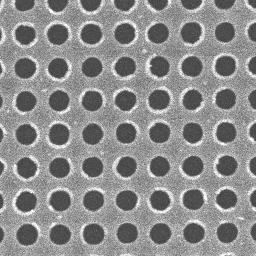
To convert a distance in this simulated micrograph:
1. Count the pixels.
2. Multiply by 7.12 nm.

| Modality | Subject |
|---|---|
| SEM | a regular array of holes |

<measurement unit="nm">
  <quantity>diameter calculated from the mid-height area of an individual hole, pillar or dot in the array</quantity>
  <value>147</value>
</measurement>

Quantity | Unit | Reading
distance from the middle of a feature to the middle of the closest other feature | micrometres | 0.235